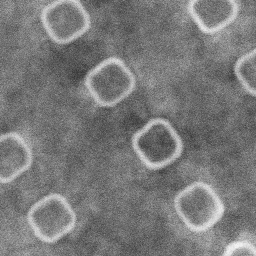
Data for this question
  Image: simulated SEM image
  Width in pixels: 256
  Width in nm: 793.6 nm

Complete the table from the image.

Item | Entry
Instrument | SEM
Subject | raised bodies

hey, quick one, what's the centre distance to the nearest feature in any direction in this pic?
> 237 nanometers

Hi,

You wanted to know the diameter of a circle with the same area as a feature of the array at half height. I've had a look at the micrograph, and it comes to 0.137 µm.